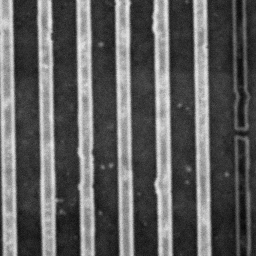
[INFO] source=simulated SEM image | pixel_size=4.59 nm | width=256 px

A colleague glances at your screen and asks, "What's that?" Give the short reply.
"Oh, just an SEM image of parallel lines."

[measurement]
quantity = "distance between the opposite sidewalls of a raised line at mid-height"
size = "48.7 nanometers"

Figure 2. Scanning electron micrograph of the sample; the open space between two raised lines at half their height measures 133 nm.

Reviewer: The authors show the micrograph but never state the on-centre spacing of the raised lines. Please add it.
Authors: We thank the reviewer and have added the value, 178 nanometers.